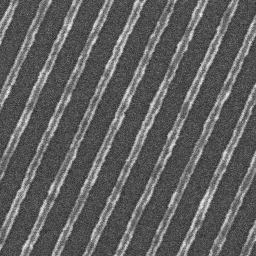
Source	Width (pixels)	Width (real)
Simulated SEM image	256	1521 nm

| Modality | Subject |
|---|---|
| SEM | parallel lines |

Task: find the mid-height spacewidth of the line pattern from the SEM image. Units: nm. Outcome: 122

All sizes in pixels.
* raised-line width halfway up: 7.96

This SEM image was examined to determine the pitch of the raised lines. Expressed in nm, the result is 170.